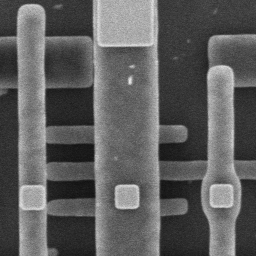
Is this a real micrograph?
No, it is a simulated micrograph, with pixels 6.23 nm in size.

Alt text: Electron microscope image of wiring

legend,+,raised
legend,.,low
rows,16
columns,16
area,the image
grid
.++...++++......
.++...++++......
.++...++++......
.++...++++......
.++...++++...+..
.++...++++...++.
.++...++++...++.
.++...++++...++.
.++...++++...++.
.++...++++...++.
.++...++++...++.
.++...++++...++.
.++...++++...++.
.++...++++...++.
.++...++++...++.
.++...++++...++.